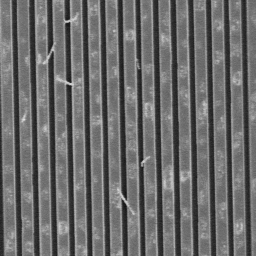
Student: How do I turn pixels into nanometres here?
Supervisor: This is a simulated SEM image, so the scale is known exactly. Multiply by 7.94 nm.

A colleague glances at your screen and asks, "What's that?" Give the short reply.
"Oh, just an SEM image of parallel lines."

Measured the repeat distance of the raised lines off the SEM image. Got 140 nanometres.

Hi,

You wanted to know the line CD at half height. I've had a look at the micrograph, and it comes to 0.0923 µm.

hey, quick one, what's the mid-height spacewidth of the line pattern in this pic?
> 46.6 nanometres